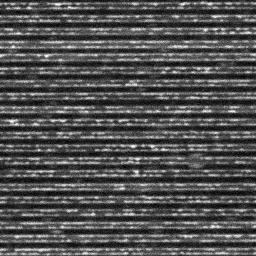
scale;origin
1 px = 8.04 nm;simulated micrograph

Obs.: parallel lines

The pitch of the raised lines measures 104 nm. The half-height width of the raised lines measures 75.3 nm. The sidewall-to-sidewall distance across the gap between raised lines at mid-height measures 28.1 nm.